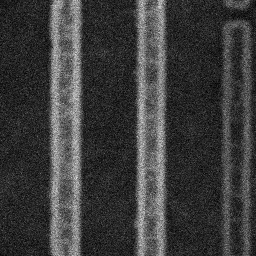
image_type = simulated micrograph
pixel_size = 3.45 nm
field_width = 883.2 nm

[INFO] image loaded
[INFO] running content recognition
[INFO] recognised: one or a few lines or trenches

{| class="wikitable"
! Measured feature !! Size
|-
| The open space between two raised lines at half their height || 225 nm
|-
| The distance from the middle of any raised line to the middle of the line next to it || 295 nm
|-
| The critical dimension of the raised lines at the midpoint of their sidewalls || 20.4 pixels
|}